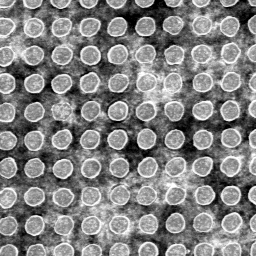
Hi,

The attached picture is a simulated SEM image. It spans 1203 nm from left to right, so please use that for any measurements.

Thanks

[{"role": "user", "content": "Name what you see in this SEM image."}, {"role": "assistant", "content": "a regular array of raised bodies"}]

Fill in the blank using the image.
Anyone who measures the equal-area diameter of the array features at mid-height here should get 88.9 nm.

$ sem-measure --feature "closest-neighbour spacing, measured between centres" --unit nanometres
129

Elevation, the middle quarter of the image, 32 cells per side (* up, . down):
................................
................................
......**...................*....
*....****...****...****...***...
**..*****..*****..*****..****...
**..****...*****..*****..****...
*....***....***....***....***...
................................
................................
......**........................
.....****...****...***...*****..
.....****..*****..*****..*****..
.....****..****...*****...****..
.....***....***....***....***...
................................
................................
....................**..........
**...****...***....****...****..
**..*****..*****..*****...****..
**..*****..****...*****..*****..
*....***....***....***....***...
................................
................................
.....................*......*...
*....***....****....***...****..
**...****..*****...****..*****..
**...****...****...****..*****..
*....***....***....****...***...
................................
................................
.............**.................
*....***....****...***....****..